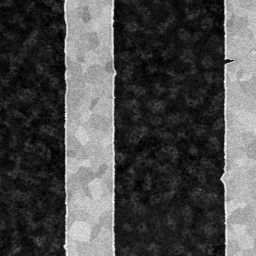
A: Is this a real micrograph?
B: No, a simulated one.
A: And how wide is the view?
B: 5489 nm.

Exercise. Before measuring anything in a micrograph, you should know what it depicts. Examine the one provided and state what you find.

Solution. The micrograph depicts one or a few lines or trenches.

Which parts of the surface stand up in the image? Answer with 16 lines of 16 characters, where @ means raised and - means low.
----@@@-------@@
----@@@-------@@
----@@@-------@@
----@@@-------@@
----@@@-------@@
----@@@-------@@
----@@@-------@@
----@@@-------@@
----@@@-------@@
----@@@-------@@
----@@@-------@@
----@@@-------@@
----@@@-------@@
----@@@-------@@
----@@@-------@@
----@@@-------@@